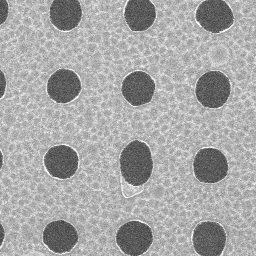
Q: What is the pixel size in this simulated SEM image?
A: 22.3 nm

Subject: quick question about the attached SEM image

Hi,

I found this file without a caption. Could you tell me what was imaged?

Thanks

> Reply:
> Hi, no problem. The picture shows holes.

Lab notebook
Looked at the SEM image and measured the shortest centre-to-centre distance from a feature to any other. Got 1660 nm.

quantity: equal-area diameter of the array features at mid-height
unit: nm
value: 788